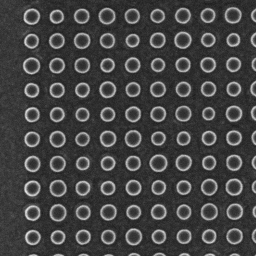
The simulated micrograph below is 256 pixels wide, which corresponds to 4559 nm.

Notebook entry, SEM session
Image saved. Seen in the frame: a regular array of raised bodies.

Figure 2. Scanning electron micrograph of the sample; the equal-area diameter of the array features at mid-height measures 0.254 µm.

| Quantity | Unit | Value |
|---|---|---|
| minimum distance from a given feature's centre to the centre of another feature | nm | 435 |